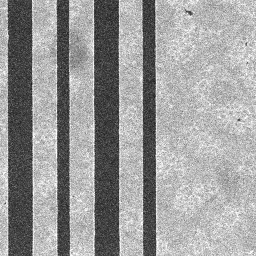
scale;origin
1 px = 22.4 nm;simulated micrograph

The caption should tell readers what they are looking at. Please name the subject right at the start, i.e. parallel lines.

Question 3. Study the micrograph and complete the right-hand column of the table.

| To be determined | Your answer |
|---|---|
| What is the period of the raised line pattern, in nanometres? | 968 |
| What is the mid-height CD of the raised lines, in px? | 23.9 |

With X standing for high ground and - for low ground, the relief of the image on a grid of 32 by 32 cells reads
X---XXX--XXX---XXX--XXXXXXXXXXXX
X---XXX--XXX---XXX--XX--XXXXXXXX
X---XXX--XXX---XXX-XXXXXXXXXXXXX
X---XXX--XXX---XXX--XXXXXXXXXXXX
X---X-X--XXX---XXX--XXXXXXXXXXX-
X---XXX--XXX---XXX--XXXXXXXXXX--
X---XXX--XXX---XXX--XXXXXXXXXXXX
X---XXX--XXX---XXX--XXXXXXXXXXXX
X---XXX--XXX---XXX--XXXXXXXXXXXX
X---XXX--XXX---XXX--XXXXXXXXXXXX
X---XXX--XXX---XXX--XXXXXXXXXXXX
X---XXX--XXX---XXX--XXXXXXXXXXXX
X---XXX--XXX---XXX--XXXXXXXXXXXX
X---XXX--XXX---XXX--XXXXXXXXXXXX
X---XXX--XXX---XXX--XXXXXXXXXXXX
X---XXX--XXX---XXX--XXXXXXXXXXXX
X---XXX--XXX---XXX--XXXXXXXXXXXX
X---XXX--XXX---XXX--XXXXXXXXXXXX
X---XXX--XXX---XXX--XXXXXXXXXXXX
X---XXX--XXX---XXX--XXXXXXXXXXXX
X---XXX--XXX---XXX--XXXXXXXXXXXX
X---XXX--XXX---XXX--XXXXXXXXXXXX
X---XXX--XXX---XXX--XXXXXXXXXXXX
X---XXX--XXX---XXX--XXXXXXXXXXXX
X---XXX---XX---XXX--XXXXXXXXXXXX
----XXX--XXX---XXX--XXXXXXXXXXXX
X---XXX--XXX---XXX--XXXXXXXXXXXX
X---XXX--XXX---XX---XXXXXXXXXXXX
X---XXX--XXX---XXX--XXXXXXXXXXXX
X---XXX--XXX---XXX--XXXXXXXXXXXX
X---XXX--XXX---XXX--XXXXXXXXXXXX
X---XXX--XXX---XXX--XXXXXXXXXXXX